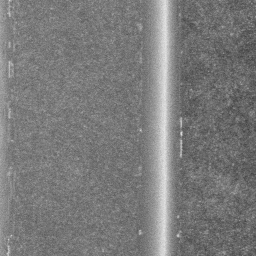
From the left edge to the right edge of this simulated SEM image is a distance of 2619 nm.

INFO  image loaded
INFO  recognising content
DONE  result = one or a few lines or trenches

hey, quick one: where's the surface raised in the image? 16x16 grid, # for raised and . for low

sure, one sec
##########......
##########......
##########......
##########......
##########......
##########......
##########......
##########......
##########......
##########......
##########......
##########......
##########......
##########......
##########......
##########......